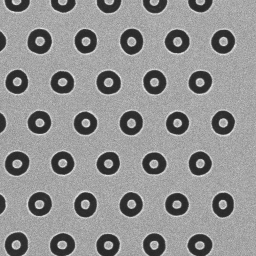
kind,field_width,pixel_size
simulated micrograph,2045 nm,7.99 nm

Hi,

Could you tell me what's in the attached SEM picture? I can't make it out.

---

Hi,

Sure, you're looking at a regular array of ring-shaped grooves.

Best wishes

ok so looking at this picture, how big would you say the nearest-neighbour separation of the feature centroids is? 364 nanometres